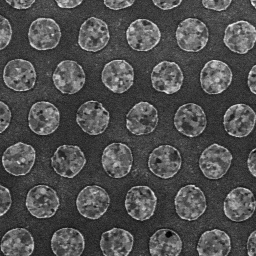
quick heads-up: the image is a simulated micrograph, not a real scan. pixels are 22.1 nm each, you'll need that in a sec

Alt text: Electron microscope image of a regular array of raised bodies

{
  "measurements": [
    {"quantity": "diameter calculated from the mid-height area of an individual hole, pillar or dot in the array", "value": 31.9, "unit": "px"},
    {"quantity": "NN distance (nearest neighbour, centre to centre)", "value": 1060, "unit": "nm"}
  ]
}